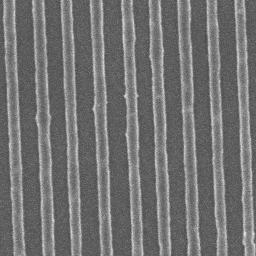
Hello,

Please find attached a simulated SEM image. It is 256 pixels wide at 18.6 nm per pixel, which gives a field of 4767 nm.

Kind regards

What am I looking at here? parallel lines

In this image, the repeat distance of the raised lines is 537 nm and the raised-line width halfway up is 193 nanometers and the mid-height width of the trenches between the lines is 332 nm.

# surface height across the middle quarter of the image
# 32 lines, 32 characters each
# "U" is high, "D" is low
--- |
UUDDDDDUUUDDDDDUUUDDDDUUUDDDDUUU
UUDDDDDDUUDDDDDUUUDDDDUUUDDDDUUU
UUDDDDDDUUDDDDDUUUDDDDUUUDDDDUUU
UUDDDDDDUUDDDDDUUUDDDDUUUDDDDUUU
UUDDDDDDUUDDDDDUUUDDDDUUUDDDDUUU
UUUDDDDDUUDDDDDUUUDDDDUUUDDDDDUU
UUUDDDDDUUDDDDDDUUDDDDUUUDDDDDUU
UUUDDDDDUUDDDDDUUUDDDDUUUDDDDDUU
UUUDDDDDUUDDDDDDUUDDDDUUUDDDDDUU
UUUDDDDDUUUDDDDDUUDDDDUUUDDDDDUU
UUUDDDDDUUDDDDDDUUDDDDUUUDDDDDUU
DUUDDDDUUUDDDDDDUUDDDDUUUDDDDDUU
DUUDDDDDUUDDDDDDUUDDDDDUUDDDDDUU
DUUDDDDDUUDDDDDDUUDDDDDUUDDDDDUU
DUUDDDDDUUDDDDDDUUDDDDDUUDDDDDUU
DUUDDDDDUUDDDDDDUUDDDDDUUDDDDDUU
DUUDDDDDUUUDDDDDUUDDDDDUUDDDDDUU
DUUDDDDDUUUDDDDUUUUDDDDUUDDDDDUU
DUUDDDDDUUUDDDDDUUDDDDDUUDDDDDUU
DUUDDDDDUUUDDDDDUUDDDDDUUDDDDDUU
DUUDDDDDUUUDDDDDUUDDDDDUUDDDDDUU
DUUDDDDDUUUDDDDDUUDDDDDUUDDDDDUU
DUUDDDDDUUUDDDDDUUDDDDDUUUDDDDUU
DUUDDDDDUUUDDDDDUUUDDDDUUUDDDDUU
DUUDDDDDUUUDDDDDUUUDDDDUUUDDDDUU
DUUDDDDDDUUDDDDDUUDDDDDUUUDDDDUU
DUUDDDDDDUUDDDDDDUUDDDDUUUDDDDUU
DUUUDDDDDUUDDDDDDUUDDDDUUUDDDDUU
DUUDDDDDDUUDDDDDUUUDDDDUUUDDDDUU
DUUUDDDDDUUDDDDDUUUDDDDUUUDDDDDU
DUUUDDDDDUUDDDDDDUUDDDDUUUDDDDDU
DUUUDDDDDUUDDDDDDUUDDDDUUUDDDDDU